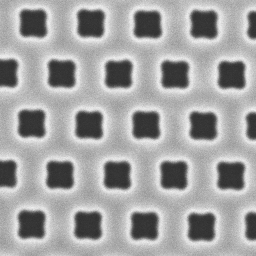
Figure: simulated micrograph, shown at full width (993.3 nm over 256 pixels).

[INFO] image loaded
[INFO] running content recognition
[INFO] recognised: a regular array of holes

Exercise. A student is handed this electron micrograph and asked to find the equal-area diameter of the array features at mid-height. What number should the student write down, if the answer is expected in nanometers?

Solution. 117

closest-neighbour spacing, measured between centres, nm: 221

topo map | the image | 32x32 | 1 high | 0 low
11111111111111111111111111111111
11100011110001111000111100011110
11000011110001111000111100011110
11000011110001111000111100011110
11100011110001111000111100011110
11111111111111111111111111111111
11111111111111111111111111111111
00111100111111111111111111111111
00111100011110000111000011100001
00111100011110001111000011100001
00111100011110001111000011100001
11111111111111111111111111111111
11111111111111111111111111111111
11111111111111111111111111111111
11000011110001111000111100011110
11000011100001111000111100011110
11000011100001111000111100011110
11111111111111111111111110111111
11111111111111111111111111111111
11111111111111111111111111111111
00111100011110001111000111100011
00111100011110001111000111100001
00111100011110001111000111100001
11111111011111001111100111110011
11111111111111111111111111111111
11111111111111111111111111111111
11100111111011111111111111111111
11000011100001110000111100011110
11000011100001110000111100011110
11000111100001110000111100011110
11111111111111111111111111111111
11111111111111111111111111111111